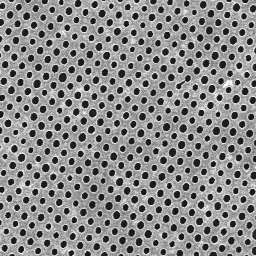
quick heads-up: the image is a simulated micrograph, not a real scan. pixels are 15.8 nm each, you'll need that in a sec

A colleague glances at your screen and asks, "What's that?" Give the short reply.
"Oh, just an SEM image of a regular array of holes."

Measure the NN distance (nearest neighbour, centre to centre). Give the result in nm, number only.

182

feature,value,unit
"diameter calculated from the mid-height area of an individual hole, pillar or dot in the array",0.107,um